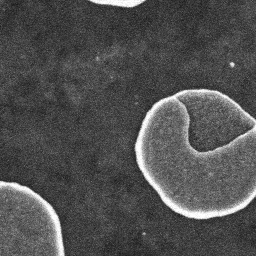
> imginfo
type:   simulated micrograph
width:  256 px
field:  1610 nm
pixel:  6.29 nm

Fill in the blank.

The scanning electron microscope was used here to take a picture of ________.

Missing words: raised bodies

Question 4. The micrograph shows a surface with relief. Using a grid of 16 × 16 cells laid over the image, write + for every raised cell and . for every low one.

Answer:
................
................
................
................
................
................
..........+.....
.........+++....
.........+++...+
.........+++++++
.........+++++++
+.........++++++
+++.......++++++
+++.............
++++............
++++............